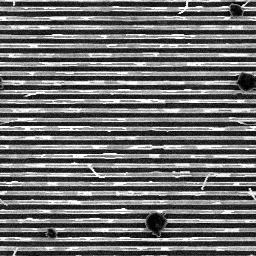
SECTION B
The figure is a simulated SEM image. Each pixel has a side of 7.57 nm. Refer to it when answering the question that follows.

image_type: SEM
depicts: parallel lines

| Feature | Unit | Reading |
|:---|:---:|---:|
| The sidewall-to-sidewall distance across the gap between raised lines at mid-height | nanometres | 43.5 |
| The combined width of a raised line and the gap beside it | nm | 69.9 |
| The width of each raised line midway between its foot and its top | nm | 29.3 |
